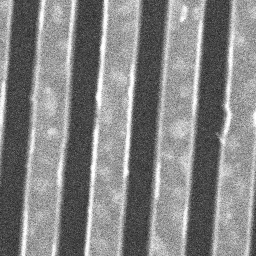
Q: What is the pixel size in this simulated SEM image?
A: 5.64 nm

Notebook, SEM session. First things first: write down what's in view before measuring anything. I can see parallel lines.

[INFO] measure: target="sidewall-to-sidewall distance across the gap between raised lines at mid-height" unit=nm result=158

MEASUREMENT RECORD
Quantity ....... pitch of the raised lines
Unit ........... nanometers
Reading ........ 360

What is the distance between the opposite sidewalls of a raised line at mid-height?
202 nm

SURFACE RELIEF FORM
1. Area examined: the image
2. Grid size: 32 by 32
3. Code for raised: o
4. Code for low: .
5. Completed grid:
o....oooo....oooo....ooooo...ooo
o....oooo....oooo....ooooo...ooo
o....oooo....oooo....oooo....ooo
o....oooo....oooo....oooo....ooo
o....oooo....oooo....oooo....ooo
o....oooo....oooo....oooo....ooo
o....oooo....oooo....oooo....ooo
o....oooo....oooo....oooo....ooo
o...ooooo....oooo...ooooo....ooo
o...ooooo...ooooo...ooooo...oooo
o...ooooo...ooooo...ooooo...oooo
o...ooooo...ooooo...ooooo...oooo
o...ooooo...ooooo...ooooo...oooo
o...ooooo...oooo....ooooo...oooo
....ooooo...oooo....oooo....oooo
....ooooo...oooo....oooo....oooo
....oooo....oooo....oooo....oooo
....oooo....oooo....oooo....oooo
....oooo....oooo....oooo....oooo
....oooo....oooo....oooo....oooo
....oooo....oooo...ooooo...ooooo
...ooooo...ooooo...ooooo...ooooo
...ooooo...ooooo...ooooo...ooooo
...ooooo...ooooo...ooooo...ooooo
...ooooo...ooooo...ooooo...ooooo
...oooo....ooooo...oooo....ooooo
...oooo....oooo....oooo....oooo.
...oooo....oooo....oooo....oooo.
...oooo....oooo....oooo....oooo.
...oooo....oooo....oooo....oooo.
...oooo....oooo....oooo....oooo.
...oooo....oooo....oooo....oooo.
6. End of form